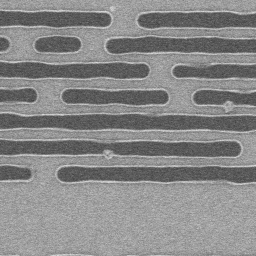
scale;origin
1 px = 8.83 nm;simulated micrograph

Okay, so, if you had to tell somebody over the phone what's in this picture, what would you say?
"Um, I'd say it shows groups of lines, slits or small figures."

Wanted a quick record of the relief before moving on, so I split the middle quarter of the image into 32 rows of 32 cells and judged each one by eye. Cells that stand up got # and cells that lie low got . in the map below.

#####################.......####
#####################......#####
#####################......#####
########...#########........##..
................................
................................
#########..............##.......
##########################......
##########################......
##########################......
................................
................................
....########.########.....###...
################################
################################
################################
###########...##################
................................
................................
#########...##############..####
################################
################################
################################
................................
................................
................................
################################
################################
################################
####...........###....######....
................................
................................